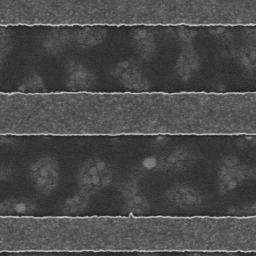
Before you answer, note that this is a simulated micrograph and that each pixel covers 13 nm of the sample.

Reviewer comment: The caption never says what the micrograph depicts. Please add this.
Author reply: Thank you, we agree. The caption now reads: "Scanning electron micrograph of one or a few lines or trenches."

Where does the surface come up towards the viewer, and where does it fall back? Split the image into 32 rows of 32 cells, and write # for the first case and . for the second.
################################
################################
################################
................................
................................
................................
................................
................................
................................
................................
................................
................................
################################
################################
################################
################################
################################
................................
................................
................................
..................#.............
................................
................................
................................
................................
................................
................................
################################
################################
################################
################################
................................